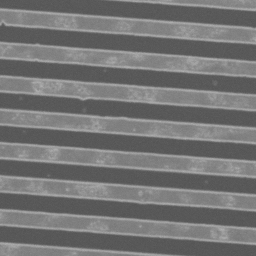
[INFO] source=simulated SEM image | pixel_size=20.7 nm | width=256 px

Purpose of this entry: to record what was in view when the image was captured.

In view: parallel lines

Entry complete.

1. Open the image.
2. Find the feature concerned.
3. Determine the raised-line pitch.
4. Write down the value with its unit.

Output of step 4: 0.691 microns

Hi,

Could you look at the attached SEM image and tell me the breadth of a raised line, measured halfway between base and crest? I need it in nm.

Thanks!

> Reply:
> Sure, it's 302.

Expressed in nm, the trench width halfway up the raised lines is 380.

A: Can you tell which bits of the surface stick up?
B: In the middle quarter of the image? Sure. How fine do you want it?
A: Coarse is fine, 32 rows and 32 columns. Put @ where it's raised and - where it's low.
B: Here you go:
------------@@@@@@@@@@@@@@@@@@@@
-------------------------@@@@@@@
--------------------------------
--------------------------------
@-------------------------------
@@@@@@@@@@@@@@@-----------------
@@@@@@@@@@@@@@@@@@@@@@@@@@@@----
@@@@@@@@@@@@@@@@@@@@@@@@@@@@@@@@
----@@--@@@@@@@@@@@@@@@@@@@@@@@@
----------------------@@@@@@@@@@
--------------------------------
--------------------------------
--------------------------------
@@@@@@@@@-@---------------------
@@@@@@@@@@@@@@@@@@@@@@@@@-------
@@@@@@@@@@@@@@@@@@@@@@@@@@@@@@@@
-----@@@@@@@@@@@@@@@@@@@@@@@@@@@
------------------@@@@@@@@@@@@@@
-----------------------------@@-
--------------------------------
--------------------------------
@@@@@---------------------------
@@@@@@@@@@@@@@@@@@@@@-----------
@@@@@@@@@@@@@@@@@@@@@@@@@@@@@@@-
@@@@@@@@@@@@@@@@@@@@@@@@@@@@@@@@
------------@@@@@@@@@@@@@@@@@@@@
-------------------------@@@@@@@
--------------------------------
--------------------------------
@-------------------------------
@@@@@@@@@@@@@@@-----------------
@@@@@@@@@@@@@@@@@@@@@@@@@@@@----